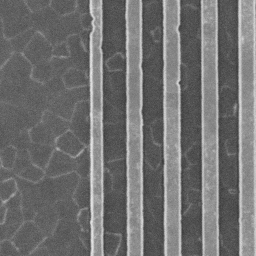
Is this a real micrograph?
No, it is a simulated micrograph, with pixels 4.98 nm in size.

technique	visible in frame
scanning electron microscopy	parallel lines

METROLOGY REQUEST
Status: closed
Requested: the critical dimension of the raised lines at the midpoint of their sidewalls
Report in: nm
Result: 74.7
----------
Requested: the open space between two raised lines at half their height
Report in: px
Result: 23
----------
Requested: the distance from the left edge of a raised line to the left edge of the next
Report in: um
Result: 0.188